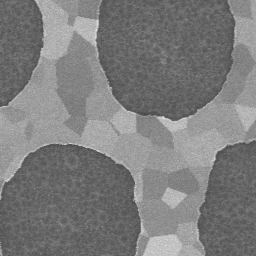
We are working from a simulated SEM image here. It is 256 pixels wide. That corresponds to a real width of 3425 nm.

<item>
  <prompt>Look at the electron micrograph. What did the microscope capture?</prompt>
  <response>holes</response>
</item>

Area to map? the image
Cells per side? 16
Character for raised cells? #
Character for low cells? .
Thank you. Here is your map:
..####........##
...###.........#
...###.........#
..####.........#
..####........##
..#####.......##
#######......###
################
################
##....########..
#.......#####...
........#####...
........#####...
.........###....
.........###....
.........####...